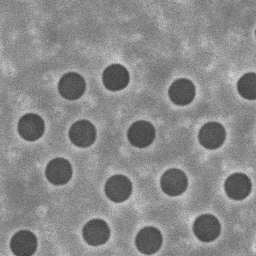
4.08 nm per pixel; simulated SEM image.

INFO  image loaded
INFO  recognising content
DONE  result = a regular array of holes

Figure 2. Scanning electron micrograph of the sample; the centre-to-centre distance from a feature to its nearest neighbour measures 212 nm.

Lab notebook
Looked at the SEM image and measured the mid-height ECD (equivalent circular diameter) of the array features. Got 115 nm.